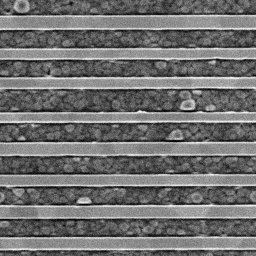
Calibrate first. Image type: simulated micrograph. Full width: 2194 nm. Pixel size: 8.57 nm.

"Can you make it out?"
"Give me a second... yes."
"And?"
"parallel lines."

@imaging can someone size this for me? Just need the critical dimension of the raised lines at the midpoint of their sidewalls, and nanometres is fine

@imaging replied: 98.6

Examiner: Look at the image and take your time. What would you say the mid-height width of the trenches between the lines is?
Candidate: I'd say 166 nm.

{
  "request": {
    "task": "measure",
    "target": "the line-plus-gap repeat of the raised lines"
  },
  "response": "271 nanometers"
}